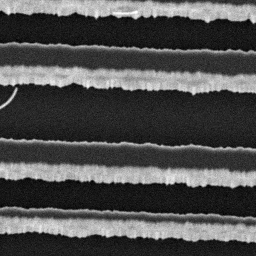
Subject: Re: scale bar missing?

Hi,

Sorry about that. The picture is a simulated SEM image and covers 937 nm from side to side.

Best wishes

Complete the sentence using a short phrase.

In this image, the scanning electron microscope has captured lines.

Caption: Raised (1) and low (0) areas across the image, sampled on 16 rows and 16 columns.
1111111111111111
0000000000000000
0000000000000000
1111111111111111
1111111111111111
0000000011111111
0000000000000000
0000000000000000
0000000000000000
1111111111111111
1111111111111111
0000000000001111
0000000000000000
1111111111111100
1101111111111111
0000000000000000